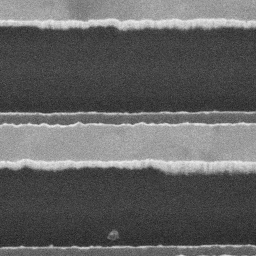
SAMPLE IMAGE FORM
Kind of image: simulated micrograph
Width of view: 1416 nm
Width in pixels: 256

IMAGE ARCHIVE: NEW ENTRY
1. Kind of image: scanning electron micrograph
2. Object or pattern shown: lines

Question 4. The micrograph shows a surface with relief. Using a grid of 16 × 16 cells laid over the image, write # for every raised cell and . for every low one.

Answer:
################
................
................
................
................
................
................
################
################
################
................
................
................
................
................
################